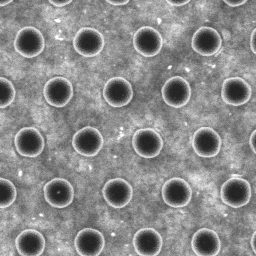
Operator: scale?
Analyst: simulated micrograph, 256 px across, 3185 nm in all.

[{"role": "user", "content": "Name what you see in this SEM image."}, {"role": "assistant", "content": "a regular array of raised bodies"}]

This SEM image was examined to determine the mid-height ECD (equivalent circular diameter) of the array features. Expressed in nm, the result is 365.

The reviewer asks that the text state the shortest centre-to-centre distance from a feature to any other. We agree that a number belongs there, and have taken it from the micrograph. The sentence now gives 57.8 px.